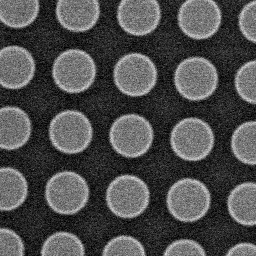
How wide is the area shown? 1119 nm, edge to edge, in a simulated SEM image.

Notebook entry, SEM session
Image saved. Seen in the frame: an array of small figures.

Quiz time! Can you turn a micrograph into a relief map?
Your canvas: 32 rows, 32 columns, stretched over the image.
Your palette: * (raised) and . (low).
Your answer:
*****..*****...*****...****....*
*****..*****...*****..*****...**
****...*****...*****..******..**
........***....****....****...**
........................**.....*
................................
***.....**......................
****...****....****....***......
****...*****..*****...*****...**
****...*****..*****...*****...**
***....****....****...*****..***
.........*.....***....****....**
...............................*
.*..............................
***....***......*...............
****..*****...*****...****.....*
****..*****...*****...****...***
***...*****...*****..******..***
**.....***....*****...****...***
................*......***....**
................................
**..............................
***...****....****.....*........
***...*****...****...*****...***
***...*****..******..*****...***
**....*****...****...*****...***
.......**.....****...*****...***
.......................*.....***
................................
**....***.......................
***...****...****.....***.....*.
***..*****...*****...****....***